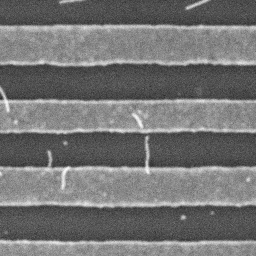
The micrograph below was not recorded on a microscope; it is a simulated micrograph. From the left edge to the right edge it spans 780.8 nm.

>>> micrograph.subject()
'lines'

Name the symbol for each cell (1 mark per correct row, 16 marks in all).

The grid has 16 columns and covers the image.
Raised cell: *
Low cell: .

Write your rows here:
................
................
****************
****************
................
................
****************
****************
................
................
*...***..*...***
****************
****************
................
................
****************